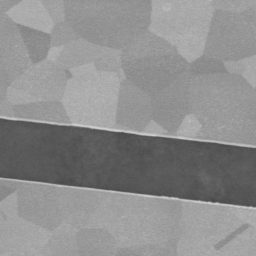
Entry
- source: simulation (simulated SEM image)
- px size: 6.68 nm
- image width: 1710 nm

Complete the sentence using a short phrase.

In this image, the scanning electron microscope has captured one or a few lines or trenches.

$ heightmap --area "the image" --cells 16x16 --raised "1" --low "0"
1111111111111111
1111111111111111
1111111111111111
1111111111111111
1111111111111111
1111111111111111
1111111111111111
0111111111111111
0000000000111111
0000000000000000
0000000000000000
1110000000000000
1111111111110000
1111111111111111
1111111111111111
1111111111111111